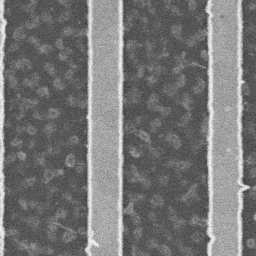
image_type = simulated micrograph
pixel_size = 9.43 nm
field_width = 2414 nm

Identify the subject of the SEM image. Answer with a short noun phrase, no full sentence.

one or a few lines or trenches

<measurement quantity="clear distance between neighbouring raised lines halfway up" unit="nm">847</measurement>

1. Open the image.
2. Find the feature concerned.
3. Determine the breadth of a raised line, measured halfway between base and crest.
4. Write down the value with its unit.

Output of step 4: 282 nm